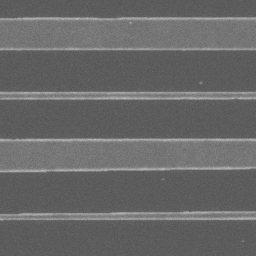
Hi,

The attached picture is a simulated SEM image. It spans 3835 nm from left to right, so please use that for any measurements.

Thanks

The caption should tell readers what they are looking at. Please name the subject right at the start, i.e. lines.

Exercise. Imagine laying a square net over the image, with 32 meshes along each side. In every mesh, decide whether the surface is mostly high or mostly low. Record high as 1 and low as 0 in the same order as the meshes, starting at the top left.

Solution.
00000000000000000000000000000000
00000000000000000000000000000000
11111111111111111111111111111111
11111111111111111111111111111111
11111111111111111111111111111111
11111111111111111111111111111111
00000000000000000000000000000000
00000000000000000000000000000000
00000000000000000000000000000000
00000000000000000000000000000000
00000000000000000000000000000000
00000000000000000000000000000000
00000000000000000000000000000000
00000000000000000000000000000000
00000000000000000000000000000000
00000000000000000000000000000000
00000000000000000000000000000000
00001100011110011111111111111111
11111111111111111111111111111111
11111111111111111111111111111111
11111111111111111111111111111111
00000000000000000000000000000000
00000000000000000000000000000000
00000000000000000000000000000000
00000000000000000000000000000000
00000000000000000000000000000000
00000000000000000000000000000000
00000000000000000000000000000000
00000000000000000000000000000000
00000000000000000000000000000000
00000000000000000000000000000000
00000000000000000000000000000000